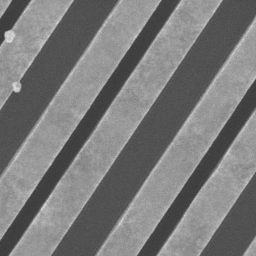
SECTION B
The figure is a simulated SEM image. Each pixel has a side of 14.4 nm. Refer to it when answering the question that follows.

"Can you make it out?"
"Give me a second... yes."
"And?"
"lines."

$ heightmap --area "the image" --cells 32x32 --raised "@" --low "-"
@---@@@@@------@@@@@--@@@@@-----
@--@@@@@------@@@@@---@@@@@-----
--@@@@@@-----@@@@@@--@@@@@------
-@@@@@@------@@@@@--@@@@@------@
-@@@@@------@@@@@---@@@@@-----@@
@@@@@@-----@@@@@@--@@@@@------@@
@@@@@------@@@@@--@@@@@------@@@
@@@@------@@@@@---@@@@@-----@@@@
@@@@-----@@@@@@--@@@@@------@@@@
@@@-----@@@@@@--@@@@@------@@@@@
@@@-----@@@@@---@@@@@-----@@@@@@
@@-----@@@@@---@@@@@------@@@@@-
@-----@@@@@@--@@@@@------@@@@@--
------@@@@@---@@@@@-----@@@@@---
-----@@@@@---@@@@@------@@@@@--@
----@@@@@@--@@@@@------@@@@@---@
----@@@@@---@@@@@-----@@@@@---@@
---@@@@@---@@@@@------@@@@@--@@@
---@@@@@--@@@@@------@@@@@---@@@
--@@@@@---@@@@@-----@@@@@---@@@@
-@@@@@---@@@@@------@@@@@--@@@@@
-@@@@@--@@@@@------@@@@@---@@@@@
@@@@@--@@@@@@-----@@@@@---@@@@@-
@@@@---@@@@@------@@@@@--@@@@@@-
@@@@--@@@@@------@@@@@--@@@@@@--
@@@--@@@@@@-----@@@@@---@@@@@---
@@---@@@@@------@@@@@--@@@@@@---
@@--@@@@@------@@@@@---@@@@@----
@--@@@@@@-----@@@@@---@@@@@-----
---@@@@@------@@@@@--@@@@@@-----
--@@@@@------@@@@@---@@@@@-----@
-@@@@@@-----@@@@@---@@@@@------@